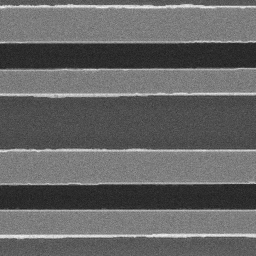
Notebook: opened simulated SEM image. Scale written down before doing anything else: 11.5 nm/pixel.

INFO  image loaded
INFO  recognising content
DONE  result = lines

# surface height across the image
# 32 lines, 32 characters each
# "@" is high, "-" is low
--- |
--------------------------------
@@@@@@@@@@@@@@@@@@@@@@@@@@@@@@@@
@@@@@@@@@@@@@@@@@@@@@@@@@@@@@@@@
@@@@@@@@@@@@@@@@@@@@@@@@@@@@@@@@
@@@@@@@@@@@@@@@@@@@@@@@@@@@@@@@@
--------------------------------
--------------------------------
--------------------------------
--------------------------------
@@@@@@@@@@@@@@@@@@@@@@@@@@@@@@@@
@@@@@@@@@@@@@@@@@@@@@@@@@@@@@@@@
@@@@@@@@@@@@@@@@@@@@@@@@@@@@@@@@
--------------------------------
--------------------------------
--------------------------------
--------------------------------
--------------------------------
--------------------------------
--------------------------------
@@@@@@@@@@@@@@@@@@@@@@@@@@@@@@@@
@@@@@@@@@@@@@@@@@@@@@@@@@@@@@@@@
@@@@@@@@@@@@@@@@@@@@@@@@@@@@@@@@
@@@@@@@@@@@@@@@@@@@@@@@@@@@@@@@@
--------------------------------
--------------------------------
--------------------------------
@@@@@@@@@@@@@@@@@@@@@@@@@@@@@@@@
@@@@@@@@@@@@@@@@@@@@@@@@@@@@@@@@
@@@@@@@@@@@@@@@@@@@@@@@@@@@@@@@@
--@-----------------------------
--------------------------------
--------------------------------